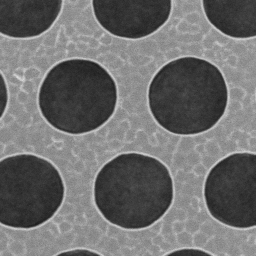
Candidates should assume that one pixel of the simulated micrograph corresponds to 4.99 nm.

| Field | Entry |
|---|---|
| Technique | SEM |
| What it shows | holes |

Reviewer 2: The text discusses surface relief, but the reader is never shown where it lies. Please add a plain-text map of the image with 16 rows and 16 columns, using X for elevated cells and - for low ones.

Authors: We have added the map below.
----XX-----XX---
---XXX----XXX---
XXXXXXXXXXXXXXXX
XXXXXXXXXXXXXXXX
XXX----XXX----XX
XXX----XX-----XX
XX-----XX-----XX
XXX----XXX----XX
XXXXXXXXXXXXXXXX
XXXXXXXXXXXXXXXX
---XXX----XXX---
----XX-----XX---
----XX-----XX---
---XXXX---XXX---
XXXXXXXXXXXXXXXX
XXXXXXXXXXXXXXXX